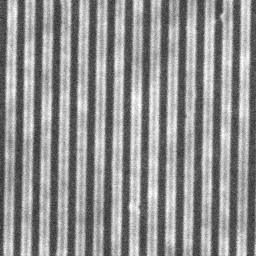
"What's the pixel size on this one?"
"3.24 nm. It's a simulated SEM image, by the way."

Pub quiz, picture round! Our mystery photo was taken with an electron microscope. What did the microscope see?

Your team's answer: parallel lines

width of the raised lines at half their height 0.0259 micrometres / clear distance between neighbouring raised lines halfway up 31.6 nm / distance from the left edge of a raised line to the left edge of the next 58.1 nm